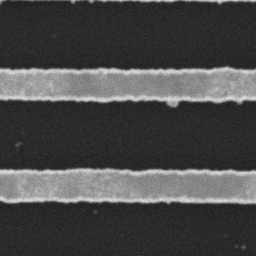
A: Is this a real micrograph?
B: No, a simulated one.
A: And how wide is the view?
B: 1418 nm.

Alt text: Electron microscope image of lines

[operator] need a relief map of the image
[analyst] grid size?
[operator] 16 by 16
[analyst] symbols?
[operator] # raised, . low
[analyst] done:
................
................
................
................
################
################
................
................
................
................
................
################
################
................
................
................